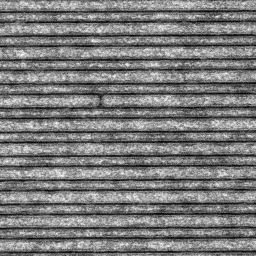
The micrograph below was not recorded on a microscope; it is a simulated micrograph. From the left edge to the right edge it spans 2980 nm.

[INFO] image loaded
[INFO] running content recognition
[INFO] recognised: parallel lines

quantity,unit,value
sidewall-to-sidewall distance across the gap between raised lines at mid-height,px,7.25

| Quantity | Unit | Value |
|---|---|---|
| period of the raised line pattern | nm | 140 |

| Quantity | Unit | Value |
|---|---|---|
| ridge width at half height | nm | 34.9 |